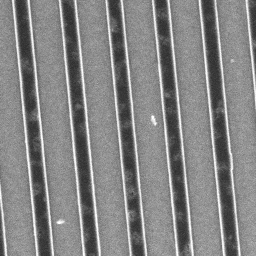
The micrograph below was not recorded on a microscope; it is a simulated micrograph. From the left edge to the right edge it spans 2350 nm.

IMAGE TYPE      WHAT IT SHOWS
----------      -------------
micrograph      parallel lines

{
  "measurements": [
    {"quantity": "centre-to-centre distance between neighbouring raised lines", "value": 426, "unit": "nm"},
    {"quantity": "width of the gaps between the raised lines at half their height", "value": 278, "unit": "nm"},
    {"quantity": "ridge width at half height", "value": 152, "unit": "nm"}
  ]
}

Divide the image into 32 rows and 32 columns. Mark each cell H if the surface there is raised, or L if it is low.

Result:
LLHHLLLHHHLLLHHLLLLHHLLLLHHLLLLH
LLHHLLLLHHLLLHHLLLLHHLLLLHHLLLLH
LLHHLLLLHHLLLLHLLLLHHLLLLHHLLLLH
LLHHLLLLHHLLLLHHLLLHHLLLLHHLLLLH
LLHHLLLLHHLLLLHHLLLLHHLLLHHLLLLH
LLHHLLLLHHLLLLHHLLLLHHLLLHHLLLLH
LLHHLLLLHHLLLLHHLLLLHHLLLLHHLLLH
LLHHLLLLHHLLLLHHLLLLHHLLLLHHLLLH
LLHHLLLLHHLLLLHHLLLLHHLLLLHHLLLL
LLLHLLLLHHLLLLHHLLLLHHLLLLHHLLLL
LLLHHLLLHHLLLLHHLLLLHHLLLLHHLLLL
LLLHHLLLLHHLLLHHLLLLHHLLLLHHLLLL
LLLHHLLLLHHLLLHHLLLLHHLLLLHHLLLL
LLLHHLLLLHHLLLHHHLLLHHLLLLHHLLLL
LLLHHLLLLHHLLLLHHLLLHHHLLLHHLLLL
LLLHHLLLLHHLLLLHHLLLLHHLLLHHLLLL
LLLHHLLLLHHLLLLHHLLLLHHLLLHHHLLL
LLLHHLLLLHHLLLLHHLLLLHHLLLLHHLLL
LLLHHLLLLHHLLLLHHLLLLHHLLLLHHLLL
LLLHHLLLLHHLLLLHHLLLLHHLLLLHHLLL
LLLLHHLLLHHLLLLHHLLLLHHLLLLHHLLL
LLLLHHLLLHHHLLLHHLLLLHHLLLLHHLLL
LLLLHHLLLLHHLLLHHLLLLHHLLLLHHLLL
LLLLHHLLLLHHLLLLHLLLLHHLLLLHHLLL
LLLLHHLLLLHHLLLLHHLLLHHLLLLHHLLL
LLLLHHLLLLHHLLLLHHLLLLHHLLLHHLLL
LLLLHHLLLLHHLLLLHHLLLLHHLLLHHLLL
LLLLHHLLLLHHLLLLHHLLLLHHLLLLHHLL
HLLLHHLLLLHHLLLLHHLLLLHHLLLLHHLL
HLLLHHLLLLHHLLLLHHLLLLHHLLLLHHLL
HLLLHHLLLLHHLLLLHHLLLLHHLLLLHHLL
HLLLLHHLLLHHLLLLHHLLLLHHLLLLHHLL